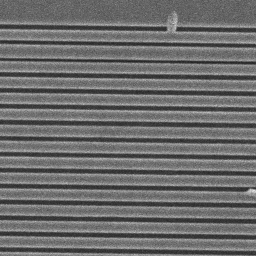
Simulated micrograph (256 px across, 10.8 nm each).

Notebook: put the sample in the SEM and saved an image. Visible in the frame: parallel lines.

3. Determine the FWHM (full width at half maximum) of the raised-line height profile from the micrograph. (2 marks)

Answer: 0.12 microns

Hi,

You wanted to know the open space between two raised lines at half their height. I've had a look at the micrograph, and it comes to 51.1 nm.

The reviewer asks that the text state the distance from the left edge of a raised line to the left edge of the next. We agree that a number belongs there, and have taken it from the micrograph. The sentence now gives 171 nanometers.